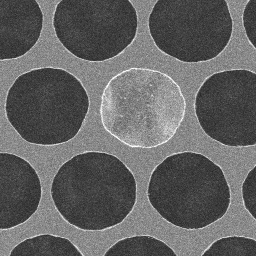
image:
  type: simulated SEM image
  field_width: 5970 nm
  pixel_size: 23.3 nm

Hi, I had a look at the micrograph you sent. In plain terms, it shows holes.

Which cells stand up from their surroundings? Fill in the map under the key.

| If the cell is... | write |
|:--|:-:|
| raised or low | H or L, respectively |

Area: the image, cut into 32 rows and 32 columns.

LLLLLHHLLLLLLLLLHHHLLLLLLLLLHHHL
LLLLLHHLLLLLLLLLLHHLLLLLLLLLLHLL
LLLLLHHLLLLLLLLLLHHLLLLLLLLLLHLL
LLLLLHHLLLLLLLLLLHHLLLLLLLLLLHHL
LLLLLHHLLLLLLLLLLHHLLLLLLLLLLHHL
LLLLHHHHLLLLLLLLHHHLLLLLLLLLHHHH
LLLHHHHHHLLLLLLHHHHHLLLLLLLLHHHH
HHHHHHHHHHHLLHHHHHHHHHLLLLHHHHHH
HHHHHHHHHHHHHHHHHHHHHHHHHHHHHHHH
HHLLLLLLLHHHHHHHHHHHHHHHHHLLLLLL
HHLLLLLLLLHHHHHHHHHHHHHHHLLLLLLL
HLLLLLLLLLLHHHHHHHHHHHHHHLLLLLLL
HLLLLLLLLLLHHHHHHHHHHHHHLLLLLLLL
HLLLLLLLLLLHHHHHHHHHHHHHLLLLLLLL
HLLLLLLLLLLHHHHHHHHHHHHHHLLLLLLL
HLLLLLLLLLHHHHHHHHHHHHHHHLLLLLLL
HHLLLLLLLLHHHHHHHHHHHHHHHHLLLLLL
HHHLLLLLLHHHHHHHHHHHHHHHHHHLLLLL
HHHHHHHHHHHHHHHHHHHHHHHHHHHHHHHH
LLHHHHHHHLLLLLHHHHHHHLLLLLHHHHHH
LLLLHHHHLLLLLLLHHHHHLLLLLLLHHHHH
LLLLLHHLLLLLLLLLHHHLLLLLLLLLHHHL
LLLLLHHLLLLLLLLLLHHLLLLLLLLLHHHL
LLLLLHLLLLLLLLLLLHLLLLLLLLLLLHLL
LLLLLHLLLLLLLLLLLHLLLLLLLLLLLHLL
LLLLLHHLLLLLLLLLLHHLLLLLLLLLLHHL
LLLLHHHLLLLLLLLLHHHHLLLLLLLLHHHL
LLLHHHHHLLLLLLLHHHHHHLLLLLLHHHHH
LHHHHHHHHHLLLHHHHHHHHHHLLHHHHHHH
HHHHHLLHHHHHHHHHHLHHHHHHHHHHHLHH
HHLLLLLLLHHHHHLLLLLLLHHHHHHLLLLL
HLLLLLLLLLHHHLLLLLLLLLHHHHLLLLLL